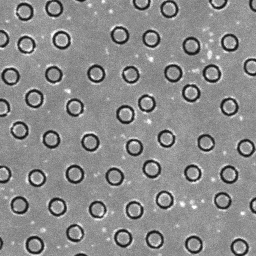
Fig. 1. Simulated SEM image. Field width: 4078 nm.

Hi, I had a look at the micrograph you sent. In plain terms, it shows a regular array of ring-shaped grooves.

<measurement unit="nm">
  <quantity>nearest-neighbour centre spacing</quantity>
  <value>517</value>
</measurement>